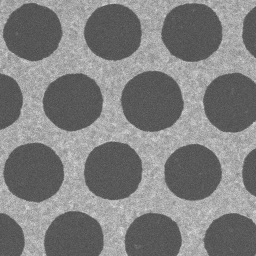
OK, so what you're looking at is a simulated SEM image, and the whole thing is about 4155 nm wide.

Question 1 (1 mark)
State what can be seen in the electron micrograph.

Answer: a regular array of holes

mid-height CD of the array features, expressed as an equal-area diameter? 964 nanometres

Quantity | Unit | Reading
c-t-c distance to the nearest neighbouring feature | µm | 1.29